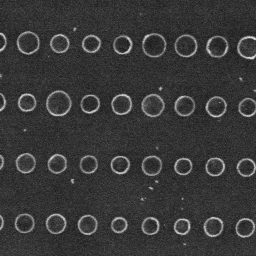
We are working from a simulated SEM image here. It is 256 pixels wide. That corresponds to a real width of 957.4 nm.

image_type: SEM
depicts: a regular array of raised bodies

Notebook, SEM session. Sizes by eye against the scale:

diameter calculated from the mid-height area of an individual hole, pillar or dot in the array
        70.4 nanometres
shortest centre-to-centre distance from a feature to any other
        0.117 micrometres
